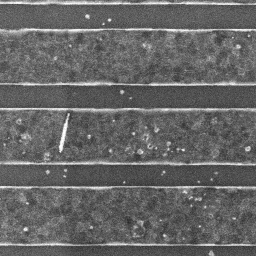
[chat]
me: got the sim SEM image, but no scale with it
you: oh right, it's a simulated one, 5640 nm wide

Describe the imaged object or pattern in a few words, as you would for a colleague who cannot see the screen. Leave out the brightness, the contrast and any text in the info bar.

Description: wiring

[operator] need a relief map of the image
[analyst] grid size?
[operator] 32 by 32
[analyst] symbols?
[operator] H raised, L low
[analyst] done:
LLLLLLLLLLLLLLLLLLLLLLLLLLLLLLLL
LLLLLLLLLLLLLLLLLLLLLLLLLLLLLLLL
LLLLLLLLLLLLLLLLLLLLLLLLLLLLLLLL
LLLLLLLLLLLLLLLLLLLLLLLLLLLLLLLL
HHHHHHHHHHHHHHHHHHHHHHHHHHHHHHHH
HHHHHHHHHHHHHHHHHHHHHHHHHHHHHHHH
HHHHHHHHHHHHHHHHHHHHHHHHHHHHHHHH
HHHHHHHHHHHHHHHHHHHHHHHHHHHHHHHH
HHHHHHHHHHHHHHHHHHHHHHHHHHHHHHHH
HHHHHHHHHHHHHHHHHHHHHHHHHHHHHHHH
LLLHHHHHHHLLLLLHHHHHHHHHHHHHLLHH
LLLLLLLLLLLLLLLLLLLLLLLLLLLLLLLL
LLLLLLLLLLLLLLLLLLLLLLLLLLLLLLLL
LLLLLLLLLLLLLLLLLLLLLLLLLLLLLLLL
HHHHHHHHHHHHHHHHHHHHHHHHHHHHHHHH
HHHHHHHHHHHHHHHHHHHHHHHHHHHHHHHH
HHHHHHHHHHHHHHHHHHHHHHHHHHHHHHHH
HHHHHHHHHHHHHHHHHHHHHHHHHHHHHHHH
HHHHHHHHHHHHHHHHHHHHHHHHHHHHHHHH
HHHHHHHHHHHHHHHHHHHHHHHHHHHHHHHH
LLLLLLLLLLLLLLLLLLLLLLHHHLLLLHHH
LLLLLLLLLLLLLLLLLLLLLLLLLLLLLLLL
LLLLLLLLLLLLLLLLLLLLLLLLLLLLLLLL
HHHHHHHHHHHLLHHHHHHHHHHHHHHHHHHL
HHHHHHHHHHHHHHHHHHHHHHHHHHHHHHHH
HHHHHHHHHHHHHHHHHHHHHHHHHHHHHHHH
HHHHHHHHHHHHHHHHHHHHHHHHHHHHHHHH
HHHHHHHHHHHHHHHHHHHHHHHHHHHHHHHH
HHHHHHHHHHHHHHHHHHHHHHHHHHHHHHHH
HHHHHHHHHHHHHHHHHHHHHHHHHHHHHHHH
HHHHHHLHHHHHHHLHHHHHHHHHHHHHHHHH
LLLLLLLLLLLLLLLLLLLLLLLLLLLLLLLL